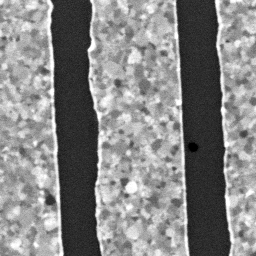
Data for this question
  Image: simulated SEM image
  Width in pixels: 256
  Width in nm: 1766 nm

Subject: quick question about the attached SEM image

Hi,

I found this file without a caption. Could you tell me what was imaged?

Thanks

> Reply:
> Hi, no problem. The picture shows one or a few lines or trenches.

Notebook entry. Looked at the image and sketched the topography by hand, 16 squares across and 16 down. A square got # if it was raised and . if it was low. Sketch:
###...#####...##
###...#####...##
###...#####...##
###...#####...##
###...#####...##
###...#####...##
###...#####...##
###...#####...##
###...#####...##
###...#####...##
####..#####...##
####..######..##
####..######..##
####..######..##
####..######..##
####..######..##